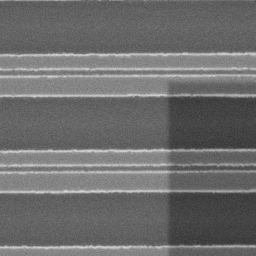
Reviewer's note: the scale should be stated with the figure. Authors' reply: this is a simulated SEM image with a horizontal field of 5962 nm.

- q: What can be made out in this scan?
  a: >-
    lines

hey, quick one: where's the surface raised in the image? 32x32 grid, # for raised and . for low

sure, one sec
................................
................................
................................
................................
................................
................................
................................
################################
################################
################################
################################
################################
................................
................................
................................
................................
................................
................................
................................
################################
################################
################################
################################
################################
................................
................................
................................
................................
................................
................................
................................
################################